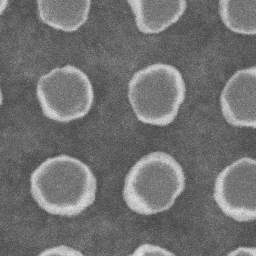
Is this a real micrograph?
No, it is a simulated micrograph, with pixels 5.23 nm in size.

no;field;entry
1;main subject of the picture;raised bodies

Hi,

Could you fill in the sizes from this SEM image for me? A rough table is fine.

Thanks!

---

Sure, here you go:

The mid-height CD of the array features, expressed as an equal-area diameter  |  289 nanometers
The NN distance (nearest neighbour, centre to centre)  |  473 nanometres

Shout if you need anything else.